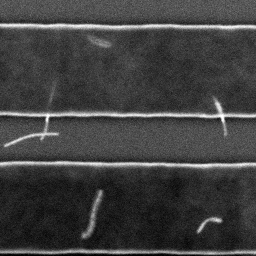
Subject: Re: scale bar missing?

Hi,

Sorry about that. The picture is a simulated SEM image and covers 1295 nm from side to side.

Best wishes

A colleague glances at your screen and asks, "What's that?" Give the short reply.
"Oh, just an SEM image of wiring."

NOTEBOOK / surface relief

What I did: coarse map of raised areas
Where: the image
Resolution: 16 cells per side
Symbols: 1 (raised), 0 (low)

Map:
0000000000000000
0000000000000000
1111111111111111
1111111111111111
1111111111111111
1111111111111111
1111111111111111
0000000000000000
0000000000000000
0000000000000000
1111111111111111
1111111111111111
1111111111111111
1111111111111111
1111111111111111
1111111111111111